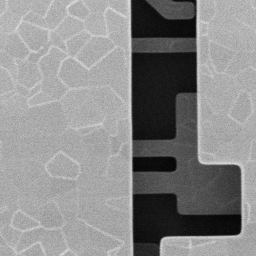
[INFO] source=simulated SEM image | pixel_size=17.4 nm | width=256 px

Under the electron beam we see wiring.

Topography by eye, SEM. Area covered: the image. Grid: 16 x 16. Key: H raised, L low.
HHHHHHHHLLLLHHHH
HHHHHHHHLLLLHHHH
HHHHHHHHLLLLHHHH
HHHHHHHHLLLLHHHH
HHHHHHHHLLLLHHHH
HHHHHHHHLLLLHHHH
HHHHHHHHLLLLHHHH
HHHHHHHHLLLLHHHH
HHHHHHHHLLLLHHHH
HHHHHHHHLLLLHHHH
HHHHHHHHLLLLLLLH
HHHHHHHHLLLLLLLH
HHHHHHHHLLLLLLLH
HHHHHHHHLLLLLLLH
HHHHHHHHLLLLLLLH
HHHHHHHHLLHHHHHH